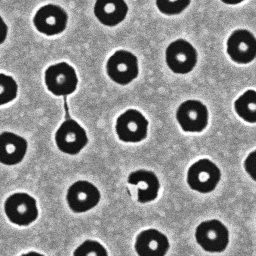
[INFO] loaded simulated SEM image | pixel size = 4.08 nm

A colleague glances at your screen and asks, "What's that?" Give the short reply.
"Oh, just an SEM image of a regular array of ring-shaped grooves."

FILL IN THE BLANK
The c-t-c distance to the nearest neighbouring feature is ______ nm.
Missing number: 243